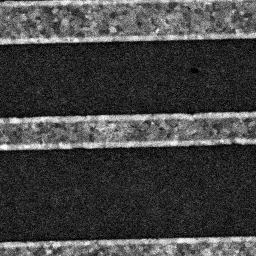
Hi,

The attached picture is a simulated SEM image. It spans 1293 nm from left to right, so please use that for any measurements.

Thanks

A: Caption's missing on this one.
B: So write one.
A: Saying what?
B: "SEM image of one or a few lines or trenches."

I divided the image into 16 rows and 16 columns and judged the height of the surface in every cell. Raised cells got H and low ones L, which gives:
HHHHHHHHHHHHHHHH
HHHHHHHHHHHHHHHH
HHHLLLLLLLLLLLLL
LLLLLLLLLLLLLLLL
LLLLLLLLLLLLLLLL
LLLLLLLLLLLLLLLL
LLLLLLLLLLLLLLLL
LLHHHHHHHHHHHHHH
HHHHHHHHHHHHHHHH
LLLLLLLLLLLLLLLL
LLLLLLLLLLLLLLLL
LLLLLLLLLLLLLLLL
LLLLLLLLLLLLLLLL
LLLLLLLLLLLLLLLL
LLLLLLLLLLLLLLLL
HHHHHHHHHHHHHHHH